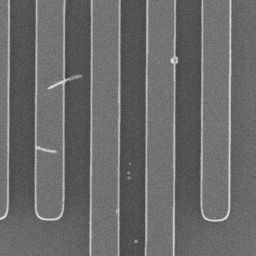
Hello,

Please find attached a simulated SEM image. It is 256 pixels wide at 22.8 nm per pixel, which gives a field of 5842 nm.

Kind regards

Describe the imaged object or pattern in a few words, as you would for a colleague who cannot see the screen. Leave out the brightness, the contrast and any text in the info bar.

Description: groups of lines, slits or small figures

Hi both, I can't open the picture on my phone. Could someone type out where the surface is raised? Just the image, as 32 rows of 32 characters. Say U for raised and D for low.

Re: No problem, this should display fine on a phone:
UDDDDUUUDDDUUUUDDDUUUUDDDUUUUDDD
UDDDDUUUDDDUUUUDDDUUUUDDDUUUUDDD
UDDDDUUUDDDUUUUDDDUUUUDDDUUUUDDD
UDDDDUUUDDDUUUUDDDUUUUDDDUUUUDDD
UDDDDUUUDDDUUUUDDDUUUUDDDUUUUDDD
UDDDDUUUDDDUUUUDDDUUUUDDDUUUUDDD
UDDDDUUUDDDUUUUDDDUUUUDDDUUUUDDD
UDDDDUUUDDDUUUUDDDUUUUDDDUUUUDDD
UDDDDUUUDDDUUUUDDDUUUUDDDUUUUDDD
UDDDDUUUDDDUUUUDDDUUUUDDDUUUUDDD
UDDDDUUUDDDUUUUDDDUUUUDDDUUUUDDD
UDDDDUUUDDDUUUUDDDUUUUDDDUUUUDDD
UDDDUUUUDDDUUUUDDDUUUUDDDUUUUDDD
UDDDUUUUDDDUUUUDDDUUUUDDDUUUUDDD
UDDDUUUUDDDUUUUDDDUUUUDDDUUUUDDD
UDDDUUUUDDDUUUUDDDUUUUDDDUUUUDDD
UDDDUUUUDDDUUUUDDDUUUUDDDUUUUDDD
UDDDUUUUDDDUUUUDDDUUUUDDDUUUUDDD
UDDDUUUUDDDUUUUDDDUUUUDDDUUUUDDD
UDDDUUUUDDDUUUUDDDUUUUDDDUUUUDDD
UDDDUUUUDDDUUUUDDDUUUUDDDUUUUDDD
UDDDUUUUDDDUUUUDDDUUUUDDDUUUUDDD
UDDDUUUUDDDUUUUDDDUUUUDDDUUUUDDD
UDDDUUUUDDDUUUUDDDUUUUDDDUUUUDDD
UDDDUUUUDDDUUUUDDDUUUUDDDUUUUDDD
UDDDUUUUDDDUUUUDDDUUUUDDDUUUUDDD
UDDDDUUUDDDUUUUDDDUUUUDDDUUUUDDD
DDDDDDDDDDDUUUUDDDUUUUDDDDUUDDDD
DDDDDDDDDDDUUUUDDDUUUUDDDDDDDDDD
DDDDDDDDDDDUUUUDDDUUUUDDDDDDDDDD
DDDDDDDDDDDUUUUDDDUUUUDDDDDDDDDD
DDDDDDDDDDDUUUUDDDUUUUDDDDDDDDDD